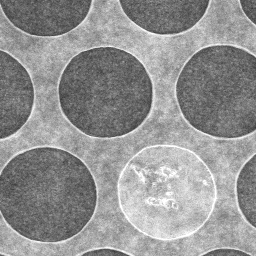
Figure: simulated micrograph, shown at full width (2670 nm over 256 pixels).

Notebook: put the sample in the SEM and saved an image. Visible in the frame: holes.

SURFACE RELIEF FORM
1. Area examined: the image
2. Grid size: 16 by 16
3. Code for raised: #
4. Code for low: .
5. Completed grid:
......##.....##.
#....###....####
################
.####...####....
..##.....##.....
..##......#.....
..##.....##.....
..##.....###....
.#####.######..#
##..############
.....##########.
......#########.
......#########.
......#########.
#....###########
################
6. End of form